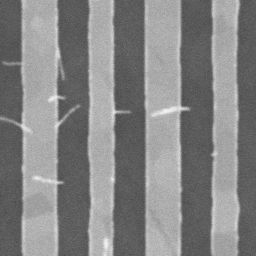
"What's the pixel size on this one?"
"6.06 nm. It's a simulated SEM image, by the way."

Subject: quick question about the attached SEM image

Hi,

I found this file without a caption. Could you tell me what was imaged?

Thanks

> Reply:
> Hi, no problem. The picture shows lines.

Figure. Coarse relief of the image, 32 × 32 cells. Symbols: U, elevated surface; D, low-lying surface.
DDDUUUUDDDDUUUDDDDUUUUDDDDDUUUDD
DDDUUUUDDDDUUUDDDDUUUUDDDDDUUUDD
DDDUUUUDDDDUUUDDDDUUUUDDDDDUUUDD
DDDUUUUDDDDUUUDDDDUUUUDDDDDUUUDD
DDDUUUUDDDDUUUDDDDUUUUDDDDDUUUDD
DDDUUUUDDDDUUUDDDDUUUUDDDDDUUUDD
DDDUUUUDDDDUUUDDDDUUUUDDDDDUUDDD
DDDUUUUDDDDUUUDDDDUUUUDDDDDUUDDD
DDDUUUUDDDDUUUDDDDUUUUDDDDDUUDDD
DDDUUUUDDDDUUUDDDDUUUUDDDDDUUDDD
DDDUUUUDDDDUUUDDDDUUUUDDDDDUUUDD
DDDUUUUDDDDUUUDDDDUUUUDDDDDUUUDD
DDDUUUUDDDDUUUDDDDUUUUDDDDDUUUDD
DDDUUUUDDDDUUUDDDDUUUUUDDDDUUUDD
DDDUUUUDDDDUUUDDDDUUUUDDDDDUUUDD
DDDUUUUDDDDUUUDDDDUUUUDDDDDUUUDD
DDDUUUUDDDDUUUDDDDUUUUDDDDDUUUDD
DDDUUUUDDDDUUUDDDDUUUUDDDDDUUUDD
DDDUUUUDDDDUUUDDDDUUUUDDDDDUUUDD
DDDUUUUDDDDUUUDDDDUUUUDDDDDUUUDD
DDDUUUUDDDDUUUDDDDUUUUDDDDDUUUDD
DDDUUUUDDDDUUUDDDDUUUUDDDDDUUUDD
DDDUUUUDDDDUUUDDDDUUUUDDDDDUUDDD
DDDUUUUDDDDUUUDDDDUUUUUDDDDUUDDD
DDDUUUUDDDDUUUDDDDUUUUDDDDDUUUDD
DDDUUUUDDDDUUUDDDDUUUUDDDDDUUUDD
DDDUUUUDDDDUUUDDDDUUUUUDDDDUUUDD
DDDUUUUDDDDUUUDDDDUUUUUDDDDUUUDD
DDDUUUUDDDDUUUDDDDUUUUDDDDUUUUDD
DDDUUUUDDDDUUUDDDDUUUUDDDDUUUUDD
DDDUUUUDDDDUUUDDDDUUUUDDDDUUUUDD
DDDUUUUDDDDUUUDDDDUUUUDDDDDUUUDD